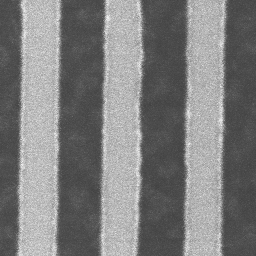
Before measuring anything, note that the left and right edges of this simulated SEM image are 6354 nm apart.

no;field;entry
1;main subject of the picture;one or a few lines or trenches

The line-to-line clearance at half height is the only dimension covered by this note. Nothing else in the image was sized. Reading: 813 nanometers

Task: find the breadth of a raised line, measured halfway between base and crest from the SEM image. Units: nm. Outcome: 1260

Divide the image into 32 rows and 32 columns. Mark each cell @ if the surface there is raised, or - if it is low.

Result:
@@@----@@@@@@----@@@@@@@----@@@@
@@@----@@@@@@----@@@@@@@----@@@@
@@@----@@@@@@-----@@@@@@----@@@@
@@@----@@@@@@----@@@@@@@----@@@@
@@@----@@@@@@----@@@@@@@----@@@@
@@@----@@@@@@----@@@@@@@----@@@@
@@@----@@@@@@-----@@@@@@----@@@@
@@@----@@@@@@-----@@@@@@----@@@@
@@@----@@@@@@----@@@@@@@----@@@@
@@@----@@@@@@-----@@@@@@----@@@@
@@@----@@@@@@----@@@@@@@----@@@@
@@@----@@@@@@----@@@@@@@----@@@@
@@@----@@@@@@----@@@@@@@----@@@@
@@@----@@@@@@----@@@@@@@----@@@@
@@@----@@@@@@----@@@@@@-----@@@@
@@@----@@@@@@----@@@@@@@----@@@@
@@@----@@@@@@----@@@@@@@----@@@@
@@@----@@@@@@----@@@@@@-----@@@@
@@@----@@@@@@----@@@@@@-----@@@@
@@@----@@@@@@----@@@@@@----@@@@@
@@@----@@@@@@----@@@@@@----@@@@@
@@@----@@@@@@----@@@@@@@----@@@@
@@@----@@@@@@----@@@@@@@----@@@@
@@@----@@@@@@----@@@@@@@---@@@@@
@@@----@@@@@@----@@@@@@----@@@@@
@@@----@@@@@@----@@@@@@-----@@@@
@@@----@@@@@@----@@@@@@----@@@@@
@@@----@@@@@@----@@@@@@----@@@@@
@@@----@@@@@@----@@@@@@----@@@@@
@@@----@@@@@@----@@@@@@----@@@@@
@@@----@@@@@@----@@@@@@----@@@@@
@@-----@@@@@@----@@@@@@----@@@@@